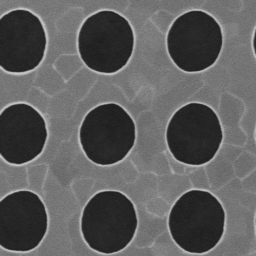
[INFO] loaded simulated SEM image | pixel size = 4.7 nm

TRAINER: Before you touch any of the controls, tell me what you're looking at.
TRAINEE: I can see holes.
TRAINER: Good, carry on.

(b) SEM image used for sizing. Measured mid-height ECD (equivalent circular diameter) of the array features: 278 nm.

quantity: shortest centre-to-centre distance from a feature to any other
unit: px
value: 87.5